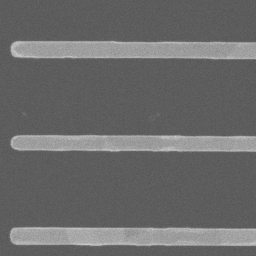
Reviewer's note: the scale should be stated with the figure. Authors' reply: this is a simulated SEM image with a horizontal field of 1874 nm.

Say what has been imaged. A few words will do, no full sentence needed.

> wiring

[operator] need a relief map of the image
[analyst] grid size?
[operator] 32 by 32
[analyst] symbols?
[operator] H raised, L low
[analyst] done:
LLLLLLLLLLLLLLLLLLLLLLLLLLLLLLLL
LLLLLLLLLLLLLLLLLLLLLLLLLLLLLLLL
LLLLLLLLLLLLLLLLLLLLLLLLLLLLLLLL
LLLLLLLLLLLLLLLLLLLLLLLLLLLLLLLL
LLLLLLLLLLLLLLLLLLLLLLLLLLLLLLLL
LLHHHHHHHHHHHHHHHHHHHHHHHHHHHHHH
LHHHHHHHHHHHHHHHHHHHHHHHHHHHHHHH
LLLLLLLLLLLLLLLLLLLLLLLLLLLLLLLL
LLLLLLLLLLLLLLLLLLLLLLLLLLLLLLLL
LLLLLLLLLLLLLLLLLLLLLLLLLLLLLLLL
LLLLLLLLLLLLLLLLLLLLLLLLLLLLLLLL
LLLLLLLLLLLLLLLLLLLLLLLLLLLLLLLL
LLLLLLLLLLLLLLLLLLLLLLLLLLLLLLLL
LLLLLLLLLLLLLLLLLLLLLLLLLLLLLLLL
LLLLLLLLLLLLLLLLLLLLLLLLLLLLLLLL
LLLLLLLLLLLLLLLLLLLLLLLLLLLLLLLL
LLLLLLLLLLLLLLLLLLLLLLLLLLLLLLLL
LLHHHHHHHHHHHHHHHHHHHHHHHHHHHHHH
LLHHHHHHHHHHHHHHHHHHHHHHHHHHHHHH
LLLLLLLLLLLLLLLLLLLLLLLLLLLLLLLL
LLLLLLLLLLLLLLLLLLLLLLLLLLLLLLLL
LLLLLLLLLLLLLLLLLLLLLLLLLLLLLLLL
LLLLLLLLLLLLLLLLLLLLLLLLLLLLLLLL
LLLLLLLLLLLLLLLLLLLLLLLLLLLLLLLL
LLLLLLLLLLLLLLLLLLLLLLLLLLLLLLLL
LLLLLLLLLLLLLLLLLLLLLLLLLLLLLLLL
LLLLLLLLLLLLLLLLLLLLLLLLLLLLLLLL
LLLLLLLLLLLLLLLLLLLLLLLLLLLLLLLL
LLLLLLLLLLLLLLLLLLLLLLLLLLLLLLLL
LHHHHHHHHHHHHHHHHHHHHHHHHHHHHHHH
LLHHHHHHHHHHHHHHHHHHHHHHHHHHHHHH
LLLLLLLLLLLLLLLLLLLLLLLLLLLLLLLL